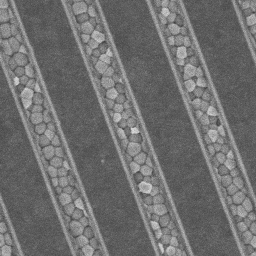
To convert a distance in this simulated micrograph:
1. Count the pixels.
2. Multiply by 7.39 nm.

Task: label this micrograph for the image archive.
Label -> one or a few lines or trenches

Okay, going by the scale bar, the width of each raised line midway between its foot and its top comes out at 0.353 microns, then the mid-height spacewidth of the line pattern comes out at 0.23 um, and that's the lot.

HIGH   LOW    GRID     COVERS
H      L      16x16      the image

LHHHLLHHHLLHHHHL
LHHHHLLHHHLLHHHL
LLHHHLLHHHLLHHHH
LLHHHLLHHHHLLHHH
LLHHHHLLHHHLLHHH
HLLHHHLLHHHLLHHH
HLLHHHLLHHHHLLHH
HLLLHHHLLHHHLLHH
HHLLHHHLLHHHLLHH
HHLLHHHLLLHHHLLH
HHHLLHHHLLHHHLLH
HHHLLHHHLLHHHHLL
HHHLLHHHHLLHHHLL
HHHHLLHHHLLHHHLL
LHHHLLHHHLLHHHHL
LHHHLLHHHHLLHHHL